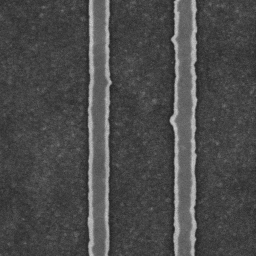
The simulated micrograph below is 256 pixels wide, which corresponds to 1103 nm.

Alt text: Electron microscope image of one or a few lines or trenches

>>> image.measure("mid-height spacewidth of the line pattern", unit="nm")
295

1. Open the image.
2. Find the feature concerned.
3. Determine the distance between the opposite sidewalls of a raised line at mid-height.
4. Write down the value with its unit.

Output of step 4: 75.4 nanometres